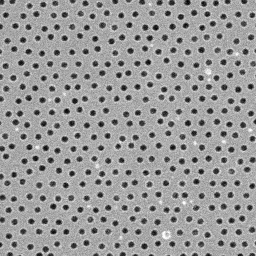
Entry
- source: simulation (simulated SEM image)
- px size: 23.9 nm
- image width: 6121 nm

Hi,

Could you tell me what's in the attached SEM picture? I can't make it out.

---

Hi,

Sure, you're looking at a regular array of holes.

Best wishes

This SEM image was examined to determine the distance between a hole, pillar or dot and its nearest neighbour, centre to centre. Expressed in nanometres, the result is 285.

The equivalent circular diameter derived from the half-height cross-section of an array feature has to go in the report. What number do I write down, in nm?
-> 162